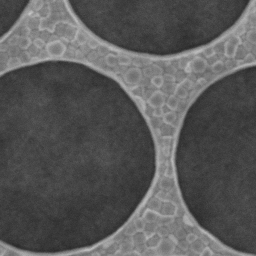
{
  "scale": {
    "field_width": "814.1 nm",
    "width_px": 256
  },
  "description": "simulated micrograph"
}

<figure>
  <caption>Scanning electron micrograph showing holes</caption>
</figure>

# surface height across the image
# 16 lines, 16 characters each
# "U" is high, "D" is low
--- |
DDUUDDDDDDDDDDDU
DUUUUDDDDDDDDDDU
UUUUUUDDDDDDDUUU
UUUUUUUUUUDUUUUU
DDDDDDUUUUUUUUDD
DDDDDDDDUUUUUDDD
DDDDDDDDUUUUDDDD
DDDDDDDDDUUDDDDD
DDDDDDDDDDUDDDDD
DDDDDDDDDDUDDDDD
DDDDDDDDDDUDDDDD
DDDDDDDDDUUDDDDD
DDDDDDDDDUUDDDDD
DDDDDDDDUUUUDDDD
DDDDDDDUUUUUUDDD
UDDDDUUUUUUUUUDD